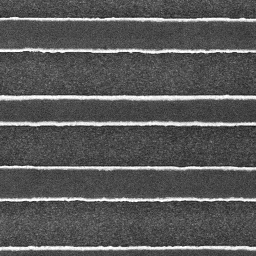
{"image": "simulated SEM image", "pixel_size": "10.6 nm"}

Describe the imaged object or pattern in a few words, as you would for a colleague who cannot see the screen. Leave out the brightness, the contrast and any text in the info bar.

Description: lines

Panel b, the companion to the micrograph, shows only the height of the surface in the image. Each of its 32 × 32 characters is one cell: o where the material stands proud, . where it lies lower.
................................
................................
oooooooooooooooooooooooooooooooo
oooooooooooooooooooooooooooooooo
oooooooooooooooooooooooooooooooo
oooooooooooooooooooooooooooooooo
...........ooo...oooo.ooooo..oo.
................................
................................
................................
................................
................................
oooooooooooooooooooooooooooooooo
oooooooooooooooooooooooooooooooo
oooooooooooooooooooooooooooooooo
....o....................ooooo..
................................
................................
................................
................................
................................
oooooooooooooooooooooooooooooooo
oooooooooooooooooooooooooooooooo
oooooooooooooooooooooooooooooooo
oooooooooooooooooooooooooooooooo
................................
................................
................................
................................
................................
................................
oooooooooooooooooooooooooooooooo